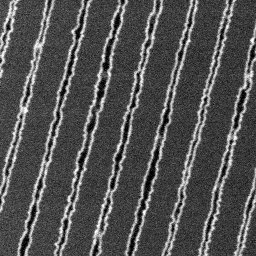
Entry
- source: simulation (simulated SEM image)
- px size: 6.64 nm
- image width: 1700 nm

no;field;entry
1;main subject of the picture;parallel lines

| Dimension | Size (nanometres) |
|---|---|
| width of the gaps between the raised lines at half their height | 187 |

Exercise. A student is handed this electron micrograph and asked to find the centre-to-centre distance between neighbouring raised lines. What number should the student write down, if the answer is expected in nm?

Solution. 231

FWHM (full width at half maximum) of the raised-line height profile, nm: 45.9